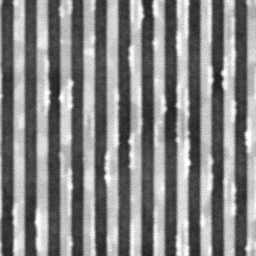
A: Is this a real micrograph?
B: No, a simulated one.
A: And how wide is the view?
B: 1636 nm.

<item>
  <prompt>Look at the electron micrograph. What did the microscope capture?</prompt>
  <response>parallel lines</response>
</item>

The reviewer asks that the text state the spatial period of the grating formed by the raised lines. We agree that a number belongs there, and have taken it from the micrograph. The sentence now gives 0.149 µm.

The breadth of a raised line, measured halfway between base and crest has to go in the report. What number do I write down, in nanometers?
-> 66.3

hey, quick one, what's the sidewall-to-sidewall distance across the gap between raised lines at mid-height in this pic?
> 83.1 nanometers